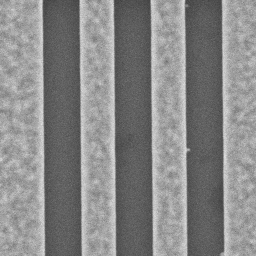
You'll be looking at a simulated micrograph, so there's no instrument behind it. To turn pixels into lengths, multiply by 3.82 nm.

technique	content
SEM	groups of lines, slits or small figures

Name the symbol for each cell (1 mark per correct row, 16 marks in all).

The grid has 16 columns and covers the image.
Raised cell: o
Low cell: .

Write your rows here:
ooo..oo..ooo..oo
ooo..oo..ooo..oo
ooo..oo..ooo..oo
ooo..oo..ooo..oo
ooo..oo..ooo..oo
ooo..oo..ooo..oo
ooo..oo..ooo..oo
ooo..oo..ooo..oo
ooo..oo...oo..oo
ooo..oo...oo..oo
ooo..oo...oo..oo
ooo..oo...oo..oo
ooo..oo...oo..oo
ooo..oo...oo..oo
ooo..oo...oo..oo
ooo..oo...oo..oo